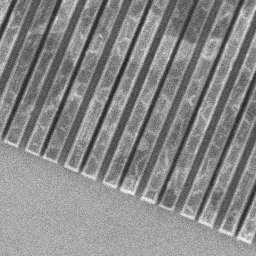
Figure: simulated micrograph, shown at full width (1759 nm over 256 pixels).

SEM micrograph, parallel lines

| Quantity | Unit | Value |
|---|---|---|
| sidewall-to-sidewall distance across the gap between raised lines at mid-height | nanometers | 43.6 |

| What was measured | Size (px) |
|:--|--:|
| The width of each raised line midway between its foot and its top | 13.4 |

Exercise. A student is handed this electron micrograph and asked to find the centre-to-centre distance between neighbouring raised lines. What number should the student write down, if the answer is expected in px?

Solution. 20.9